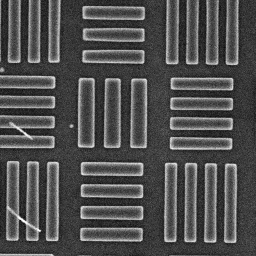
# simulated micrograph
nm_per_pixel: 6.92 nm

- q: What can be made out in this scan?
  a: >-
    groups of lines, slits or small figures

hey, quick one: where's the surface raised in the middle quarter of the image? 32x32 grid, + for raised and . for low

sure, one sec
................................
................................
................................
................................
....+++...++++...++++......+++++
....+++...++++...++++......+++++
....+++...++++...++++...........
....+++...++++...++++...........
....+++...++++...++++...........
....+++...++++...++++......+++++
....+++...++++...++++......+++++
....+++...++++...++++...........
....+++...++++...++++...........
....+++...++++...++++......+++++
....+++...++++...++++......+++++
....+++...++++...++++......+++++
....+++...++++...++++...........
....+++...++++...++++...........
....+++...++++...++++......++++.
....+++...++++...++++......+++++
....+++...++++...++++......+++++
................................
................................
................................
................................
....++++++++++++++++......++..++
....++++++++++++++++......++..++
....++++++++++++++++......++..++
..........................++..++
..........................++..++
.....++++++++++++++.......++..++
....++++++++++++++++......++..++